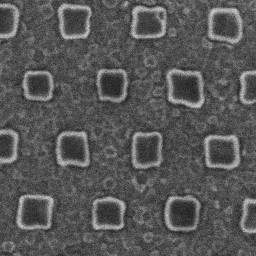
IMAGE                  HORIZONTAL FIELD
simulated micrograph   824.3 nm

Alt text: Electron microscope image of a regular array of raised bodies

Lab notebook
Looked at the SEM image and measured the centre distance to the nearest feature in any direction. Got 235 nm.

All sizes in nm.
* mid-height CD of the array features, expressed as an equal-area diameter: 108